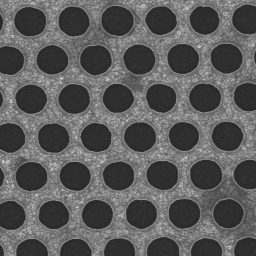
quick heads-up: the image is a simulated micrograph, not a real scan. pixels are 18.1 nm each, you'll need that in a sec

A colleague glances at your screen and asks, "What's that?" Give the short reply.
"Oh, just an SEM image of a regular array of holes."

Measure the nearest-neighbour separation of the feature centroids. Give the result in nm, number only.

787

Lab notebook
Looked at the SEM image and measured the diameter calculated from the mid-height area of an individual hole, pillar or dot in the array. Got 0.552 µm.